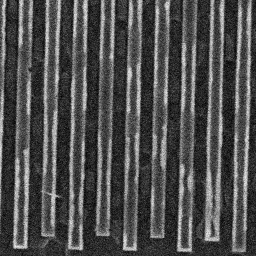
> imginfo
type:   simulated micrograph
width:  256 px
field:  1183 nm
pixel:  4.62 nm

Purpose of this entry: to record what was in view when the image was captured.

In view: parallel lines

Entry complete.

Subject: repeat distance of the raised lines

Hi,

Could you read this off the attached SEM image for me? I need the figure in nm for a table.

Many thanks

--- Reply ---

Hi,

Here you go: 126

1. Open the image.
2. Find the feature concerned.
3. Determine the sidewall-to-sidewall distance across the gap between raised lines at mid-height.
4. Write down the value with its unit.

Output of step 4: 64.2 nanometres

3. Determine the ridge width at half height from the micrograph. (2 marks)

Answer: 64.2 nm